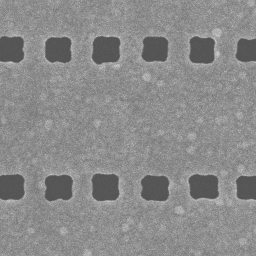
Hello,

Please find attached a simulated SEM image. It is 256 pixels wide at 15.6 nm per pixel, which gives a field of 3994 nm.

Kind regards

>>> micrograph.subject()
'a regular array of holes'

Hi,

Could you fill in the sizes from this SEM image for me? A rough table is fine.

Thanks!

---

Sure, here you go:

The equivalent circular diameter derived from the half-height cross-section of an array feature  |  0.452 µm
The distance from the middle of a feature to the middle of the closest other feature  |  0.742 µm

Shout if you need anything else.